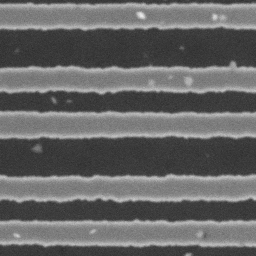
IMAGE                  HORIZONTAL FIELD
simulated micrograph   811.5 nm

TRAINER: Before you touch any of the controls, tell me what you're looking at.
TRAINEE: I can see lines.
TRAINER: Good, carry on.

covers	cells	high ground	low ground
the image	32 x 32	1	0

00010000000000011100010111100001
11111111111111111111111111111111
11111111111111111111111111111111
11111110111100101010100100000111
00000000000000000000000000000000
00000000000000000000000000000000
00000000000000000000000000000000
00000000000000000000000000000000
00011011110000100111111100111111
11111111111111111111111111111111
11111111111111111111111111111111
01000000000010000000001011000000
00000000000000000000000000000000
00000000000000000000000000000000
11111111111111111111111111111111
11111111111111111111111111111111
11111111111111111111111111111111
00000000000000000000000000000000
00000000000000000000000000000000
00000000000000000000000000000000
00000000000000000000000000000000
00000000000000000000000000000000
11111111111111111111111111111111
11111111111111111111111111111111
11111111111111111111111111111111
00000000000000000000000000000000
00000000000000000000000000000000
00000000000000000000000000000000
11111111111111111111111111111111
11111111111111111111111111111111
11111111111111111111111111111111
00000000000000000000000000000000